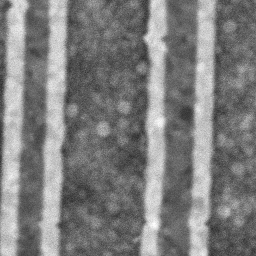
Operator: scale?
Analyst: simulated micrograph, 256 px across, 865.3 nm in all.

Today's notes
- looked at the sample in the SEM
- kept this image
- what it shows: one or a few lines or trenches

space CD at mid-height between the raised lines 343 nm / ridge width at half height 147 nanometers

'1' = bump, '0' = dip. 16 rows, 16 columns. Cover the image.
0111000000111000
0111000000111000
0111000000111000
0111000000111000
0110000000111000
0110000000111000
0110000000111000
0110000000111000
0110000000111000
0110000000111000
0110000000111000
0110000000111000
0110000000111000
0110000000110000
0110000001110000
0110000001110000